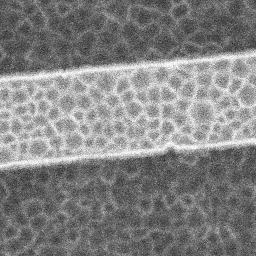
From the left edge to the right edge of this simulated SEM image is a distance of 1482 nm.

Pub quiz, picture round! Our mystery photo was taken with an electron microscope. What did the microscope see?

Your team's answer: one or a few lines or trenches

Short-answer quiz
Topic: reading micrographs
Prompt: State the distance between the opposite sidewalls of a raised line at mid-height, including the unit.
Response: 0.492 um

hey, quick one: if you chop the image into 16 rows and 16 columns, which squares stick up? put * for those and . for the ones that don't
................
................
................
...............*
.....***********
****************
****************
****************
****************
********........
................
................
................
................
................
................